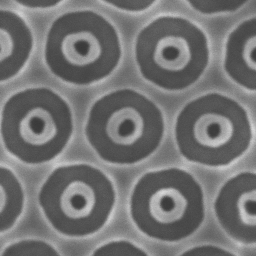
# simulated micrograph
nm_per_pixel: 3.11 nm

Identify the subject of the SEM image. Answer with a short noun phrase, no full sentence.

ring-shaped grooves with a dot in the middle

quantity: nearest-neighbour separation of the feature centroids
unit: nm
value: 270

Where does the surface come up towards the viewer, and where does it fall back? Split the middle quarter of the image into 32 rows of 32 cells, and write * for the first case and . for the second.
.............******.....******..
.............******........*....
...........********.............
..........**********............
.........*************..........
************************.......*
**************...*********...***
***********........*************
*********............***********
.*******..............*********.
.******................*******..
..*****.......****......******..
..****......*******......****...
..****......*******......***....
..****.....****..**......***....
..***......***....*......***....
..***......***....*......***....
..***......***...**......***....
..***.......******.......***....
.*****.......****.......****....
*******.................****....
********...............******...
********..............*******...
*********...........**********..
***********.......**************
.......*************************
.........****************.....**
..........**********...........*
...........********.............
...*........******..............
.*****......******..............
*******......****.......*.*.....